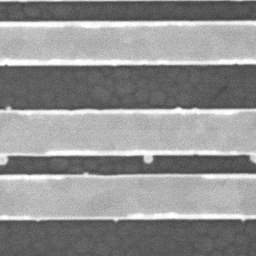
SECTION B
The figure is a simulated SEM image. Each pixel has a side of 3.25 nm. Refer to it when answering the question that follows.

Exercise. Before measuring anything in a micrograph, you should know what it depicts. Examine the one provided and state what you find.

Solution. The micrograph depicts one or a few lines or trenches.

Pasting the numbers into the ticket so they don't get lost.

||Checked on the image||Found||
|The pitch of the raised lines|0.249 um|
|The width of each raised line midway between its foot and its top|141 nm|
